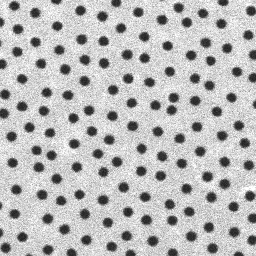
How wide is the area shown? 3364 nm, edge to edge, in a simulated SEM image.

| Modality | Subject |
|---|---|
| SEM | a regular array of holes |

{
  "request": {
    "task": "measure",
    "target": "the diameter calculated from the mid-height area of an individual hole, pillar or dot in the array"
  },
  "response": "0.139 micrometres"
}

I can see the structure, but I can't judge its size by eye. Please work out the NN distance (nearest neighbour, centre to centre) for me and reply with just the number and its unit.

270 nm